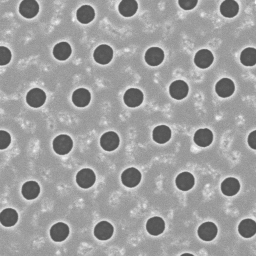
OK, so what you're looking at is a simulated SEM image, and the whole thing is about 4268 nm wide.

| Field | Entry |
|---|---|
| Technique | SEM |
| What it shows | a regular array of holes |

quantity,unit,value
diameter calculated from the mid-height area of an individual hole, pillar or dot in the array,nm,334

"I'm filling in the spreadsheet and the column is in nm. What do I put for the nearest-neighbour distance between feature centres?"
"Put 703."